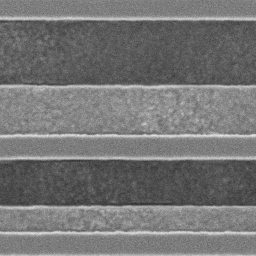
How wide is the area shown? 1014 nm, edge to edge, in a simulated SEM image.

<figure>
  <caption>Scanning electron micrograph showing lines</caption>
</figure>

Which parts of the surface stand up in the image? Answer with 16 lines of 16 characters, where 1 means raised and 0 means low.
1111111111111111
0000000000000000
0000000000000000
0000000000000000
0000000000000000
1111111111111111
1111111111111111
1111111111111111
1111111111111111
1111111111111111
0000000000000000
0000000000000000
0000000000000000
1111111111111111
1111111111111111
1111111111111111